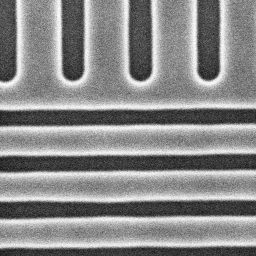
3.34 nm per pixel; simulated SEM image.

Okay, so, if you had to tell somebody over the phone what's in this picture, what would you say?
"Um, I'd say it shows groups of lines, slits or small figures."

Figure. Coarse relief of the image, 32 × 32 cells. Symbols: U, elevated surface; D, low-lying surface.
DDUUUUUDDDDUUUUUDDDUUUUUDDDDUUUU
DDUUUUUDDDDUUUUUDDDUUUUUDDDDUUUU
DDUUUUUDDDDUUUUUDDDUUUUUDDDDUUUU
DDUUUUUDDDDUUUUUDDDUUUUUDDDDUUUU
DDUUUUUDDDDUUUUUDDDUUUUUDDDDUUUU
DDUUUUUDDDDUUUUUDDDUUUUUDDDDUUUU
DDUUUUUUDDDUUUUUDDDUUUUUDDDDUUUU
DDUUUUUUDDDUUUUUDDDUUUUUDDDDUUUU
DDUUUUUUDDDUUUUUDDDUUUUUDDDDUUUU
DDUUUUUUDDUUUUUUDDDUUUUUUDDUUUUU
UUUUUUUUUUUUUUUUUUUUUUUUUUUUUUUU
UUUUUUUUUUUUUUUUUUUUUUUUUUUUUUUU
UUUUUUUUUUUUUUUUUUUUUUUUUUUUUUUU
UUUUUUUUUUUUUDDDDUUUDDDDDDDDDDDD
DDDDDDDDDDDDDDDDDDDDDDDDDDDDDDDD
DDDDDDDDDDDDDDDDDDDDDDDDDDDDDDDD
UUUUUUUUUUUUUUUUUUUUUUUUUUUUUUUU
UUUUUUUUUUUUUUUUUUUUUUUUUUUUUUUU
UUUUUUUUUUUUUUUUUUUUUUUUUUUUUUUU
DDDDDDDDDDDDDDDDDDDDDDDDDDDDDDDD
DDDDDDDDDDDDDDDDDDDDDDDDDDDDDDDD
DDDDDDDDDDDDDDDDDDDDDDDDDDDDDDUU
UUUUUUUUUUUUUUUUUUUUUUUUUUUUUUUU
UUUUUUUUUUUUUUUUUUUUUUUUUUUUUUUU
UUUUUUUUUUUUUUUUUUUUUUUUUUUUUUUU
DDDDDDDDDDDDDDDDDDDDDDDDDDDDDDDD
DDDDDDDDDDDDDDDDDDDDDDDDDDDDDDDD
DDDDDUUUUUUUUUUUUUUUUUUUUUUUUUUU
UUUUUUUUUUUUUUUUUUUUUUUUUUUUUUUU
UUUUUUUUUUUUUUUUUUUUUUUUUUUUUUUU
UUUUUUUUUUUUUUUUUUUUUUUUUUUUUUUU
DDDDDDDDDDDDDDDDDDDDDDDDDDDDDDDD